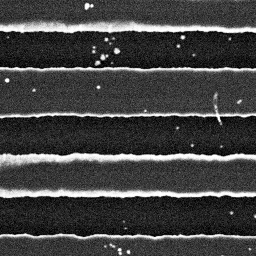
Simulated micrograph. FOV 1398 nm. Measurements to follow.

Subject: lines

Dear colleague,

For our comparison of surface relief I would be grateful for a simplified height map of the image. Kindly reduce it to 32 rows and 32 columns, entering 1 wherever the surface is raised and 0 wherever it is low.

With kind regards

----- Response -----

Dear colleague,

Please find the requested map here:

11111111111111111111111111111111
11111111111111111111111111111111
11111111111111111111111111111111
11111111111111111111111111111111
00000000000000000000000000000000
00000000000000000000000000000000
00000000000000000000000000000000
00000000000000000000000000000000
00000000000000000000000000000000
11111111111111111111111111111111
11111111111111111111111111111111
11111111111111111111111111111111
11111111111111111111111111111111
11111111111111111111111111111111
11111000000011111000000001010010
00000000000000000000000000000000
00000000000000000000000000000000
00000000000000000000000000000000
00000000000000000000000000000000
00000000011100000000001100000110
11111111111111111111111111111111
11111111111111111111111111111111
11111111111111111111111111111111
11111111111111111111111111111111
00000000000000000000001110000000
00000000000000000000000000000000
00000000000000000000000000000000
00000000000000000000000000000000
00000000000000000000000000000000
11111111110111111110111111111100
11111111111111111111111111111111
11111111111111111111111111111111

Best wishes